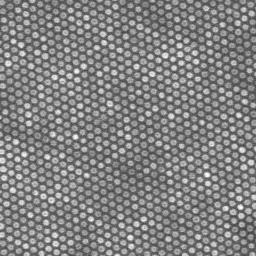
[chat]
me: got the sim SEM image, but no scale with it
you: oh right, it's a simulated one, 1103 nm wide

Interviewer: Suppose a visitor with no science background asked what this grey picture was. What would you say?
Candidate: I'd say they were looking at a regular array of raised bodies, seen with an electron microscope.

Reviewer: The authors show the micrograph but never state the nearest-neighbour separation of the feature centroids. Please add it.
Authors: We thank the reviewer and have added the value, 36.4 nm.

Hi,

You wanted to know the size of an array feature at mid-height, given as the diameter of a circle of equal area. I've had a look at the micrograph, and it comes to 22.3 nanometers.